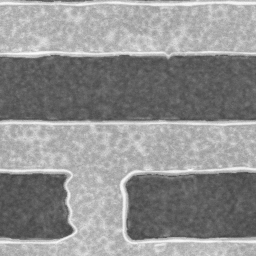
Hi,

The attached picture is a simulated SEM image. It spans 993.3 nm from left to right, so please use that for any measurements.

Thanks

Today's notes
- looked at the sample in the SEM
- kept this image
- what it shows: one or a few lines or trenches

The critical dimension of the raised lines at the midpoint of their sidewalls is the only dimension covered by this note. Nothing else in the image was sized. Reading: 190 nm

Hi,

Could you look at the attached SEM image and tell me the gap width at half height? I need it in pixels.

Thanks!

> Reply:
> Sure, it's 70.3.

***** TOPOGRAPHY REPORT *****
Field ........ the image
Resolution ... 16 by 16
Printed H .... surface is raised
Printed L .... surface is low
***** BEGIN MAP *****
HHHHHHHHHHHHHHHH
HHHHHHHHHHHHHHHH
HHHHHHHHHHHHHHHH
LLLLLLLLLLLLLLLL
LLLLLLLLLLLLLLLL
LLLLLLLLLLLLLLLL
LLLLLLLLLLLLLLLL
LLLLLLLLLLLLLLLL
HHHHHHHHHHHHHHHH
HHHHHHHHHHHHHHHH
HHHHHHHHHHHHHHHH
LLLLHHHHLLLLLLLL
LLLLHHHHLLLLLLLL
LLLLHHHHLLLLLLLL
LLLLHHHHLLLLLLLL
HHHHHHHHHHHHHHHH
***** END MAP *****